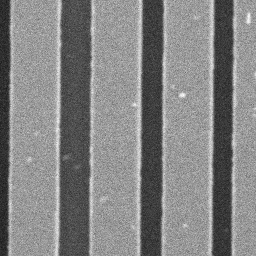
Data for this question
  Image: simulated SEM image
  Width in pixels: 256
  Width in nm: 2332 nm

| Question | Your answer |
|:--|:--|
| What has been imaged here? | lines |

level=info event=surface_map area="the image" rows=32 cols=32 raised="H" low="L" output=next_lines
LHHHHHHHLLLLHHHHHHLLLHHHHHHLLHHH
LHHHHHHHLLLLHHHHHHLLLHHHHHHLLHHH
LHHHHHHLLLLLHHHHHHLLLHHHHHHLLHHH
LHHHHHHHLLLHHHHHHHLLLHHHHHHLLHHH
LHHHHHHLLLLLHHHHHHLLLHHHHHHLLHHH
LHHHHHHHLLLLHHHHHHLLLHHHHHHLLHHH
LHHHHHHLLLLLHHHHHHLLLHHHHHHLLHHH
LHHHHHHLLLLHHHHHHHLLHHHHHHHLLHHH
LHHHHHHLLLLHHHHHHHLLHHHHHHHLLHHH
LHHHHHHLLLLHHHHHHHLLHHHHHHHLLHHH
LHHHHHHLLLLHHHHHHHLLHHHHHHHLLHHH
LHHHHHHLLLLHHHHHHHLLHHHHHHHLLHHH
LHHHHHHLLLLHHHHHHHLLHHHHHHHLLHHH
LHHHHHHLLLLHHHHHHHLLHHHHHHHLLHHH
LHHHHHHLLLLHHHHHHHLLHHHHHHHLLHHH
LHHHHHHLLLLHHHHHHHLLHHHHHHHLLHHH
LHHHHHHLLLLHHHHHHHLLHHHHHHHLLHHH
LHHHHHHLLLLHHHHHHHLLHHHHHHHLLHHH
LHHHHHHLLLLHHHHHHHLLHHHHHHHLLHHH
LHHHHHHLLLLHHHHHHHLLHHHHHHLLLHHH
LHHHHHHLLLLHHHHHHHLLHHHHHHLLLHHH
LHHHHHHLLLLHHHHHHLLLHHHHHHLLLHHH
LHHHHHHLLLLHHHHHHLLLHHHHHHLLLHHH
LHHHHHHLLLLHHHHHHLLLHHHHHHLLLHHH
LHHHHHHLLLLHHHHHHLLLHHHHHHLLLHHH
LHHHHHHLLLLHHHHHHLLLHHHHHHLLLHHH
LHHHHHHLLLLHHHHHHLLLHHHHHHLLLHHH
LHHHHHHLLLLHHHHHHLLLHHHHHHLLLHHH
LHHHHHHLLLLHHHHHHLLLHHHHHHLLLHHH
LHHHHHHLLLLHHHHHHLLLHHHHHHLLLHHH
LHHHHHHLLLLHHHHHHLLLHHHHHHLLLHHH
LHHHHHHLLLLHHHHHHLLLHHHHHHLLLHHH